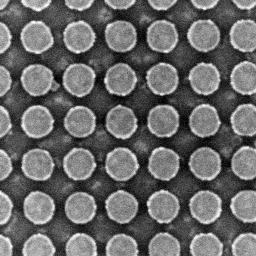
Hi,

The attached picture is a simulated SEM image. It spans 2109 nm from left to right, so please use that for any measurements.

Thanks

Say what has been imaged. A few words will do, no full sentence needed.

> a regular array of raised bodies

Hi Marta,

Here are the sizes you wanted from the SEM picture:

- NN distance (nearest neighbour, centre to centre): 41.5 px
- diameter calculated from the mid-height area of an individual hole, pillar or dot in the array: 250 nanometres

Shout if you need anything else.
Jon